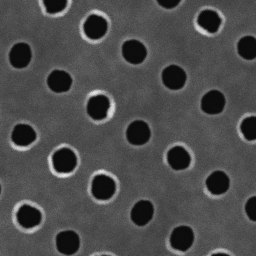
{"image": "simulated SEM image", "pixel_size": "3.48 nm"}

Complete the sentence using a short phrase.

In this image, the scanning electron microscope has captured a regular array of holes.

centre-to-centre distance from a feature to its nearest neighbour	46.8	pixels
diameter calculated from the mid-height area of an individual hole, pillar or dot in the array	0.0851	µm